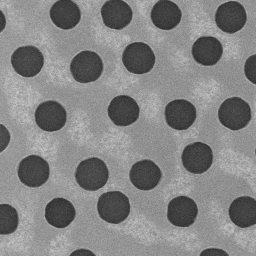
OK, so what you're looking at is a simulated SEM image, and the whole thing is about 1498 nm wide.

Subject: a regular array of holes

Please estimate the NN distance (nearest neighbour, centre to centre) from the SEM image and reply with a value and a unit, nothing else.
290 nm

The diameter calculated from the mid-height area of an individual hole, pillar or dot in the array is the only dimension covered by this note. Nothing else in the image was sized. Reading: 0.188 micrometres